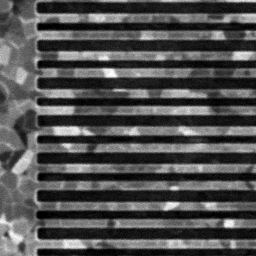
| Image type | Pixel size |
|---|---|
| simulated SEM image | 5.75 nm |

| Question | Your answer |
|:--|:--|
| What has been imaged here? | parallel lines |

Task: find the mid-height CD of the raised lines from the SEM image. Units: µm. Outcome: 0.0438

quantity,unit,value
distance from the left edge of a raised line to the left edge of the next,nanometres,108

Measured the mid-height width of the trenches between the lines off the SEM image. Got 0.0733 um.